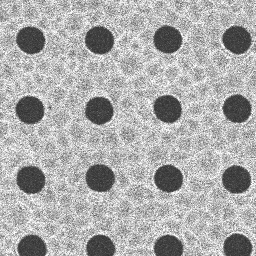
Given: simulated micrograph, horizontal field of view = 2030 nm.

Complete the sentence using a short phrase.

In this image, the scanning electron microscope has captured a regular array of holes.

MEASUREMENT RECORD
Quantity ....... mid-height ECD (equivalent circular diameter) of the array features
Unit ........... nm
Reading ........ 225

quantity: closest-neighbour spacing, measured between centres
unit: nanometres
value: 543